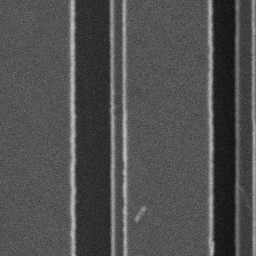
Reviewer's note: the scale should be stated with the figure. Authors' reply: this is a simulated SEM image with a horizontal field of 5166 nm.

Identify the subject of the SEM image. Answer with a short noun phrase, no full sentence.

lines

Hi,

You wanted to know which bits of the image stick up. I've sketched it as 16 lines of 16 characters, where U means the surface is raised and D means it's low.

UUUUUDDDUUUUUDDD
UUUUUDDDUUUUUDDD
UUUUUDDDUUUUUDDD
UUUUUDDDUUUUUDDD
UUUUUDDDUUUUUDDD
UUUUUDDDUUUUUDDD
UUUUUDDDUUUUUDDD
UUUUUDDDUUUUUDDD
UUUUUDDDUUUUUDDD
UUUUUDDDUUUUUDDD
UUUUUDDDUUUUUDDD
UUUUUDDDUUUUUDDD
UUUUUDDDUUUUUDDD
UUUUUDDDUUUUUDDD
UUUUUDDDUUUUUDDD
UUUUUDDDUUUUUDDD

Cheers